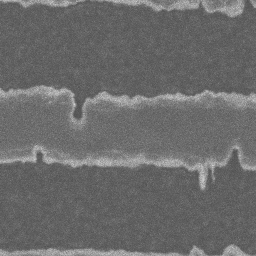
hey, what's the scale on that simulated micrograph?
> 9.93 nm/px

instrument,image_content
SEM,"one or a few lines or trenches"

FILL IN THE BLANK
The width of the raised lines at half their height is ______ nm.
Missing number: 682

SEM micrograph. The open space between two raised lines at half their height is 894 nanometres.